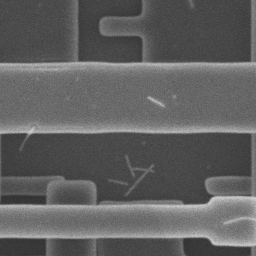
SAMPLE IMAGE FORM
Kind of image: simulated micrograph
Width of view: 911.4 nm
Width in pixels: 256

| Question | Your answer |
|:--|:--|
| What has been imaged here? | wiring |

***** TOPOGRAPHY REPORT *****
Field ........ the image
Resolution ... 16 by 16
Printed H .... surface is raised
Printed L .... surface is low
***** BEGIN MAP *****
LLLLLLLLLLLLLLLL
LLLLLLLLLLLLLLLL
LLLLLLLLLLLLLLLL
LLLLLLLLLLLLLLLL
HHHHHHHHHHHHHHHH
HHHHHHHHHHHHHHHH
HHHHHHHHHHHHHHHH
HHHHHHHHHHHHHHHH
LLLLLLLLLLLLLLLL
LLLLLLLLLLLLLLLL
LLLLLLLLLLLLLLLL
LLLLLLLLLLLLLLLL
LLLLLLLLLLLLLHHH
HHHHHHHHHHHHHHHH
HHHHHHHHHHHHHHHH
LLLLLLLLLLLLLLLL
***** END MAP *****